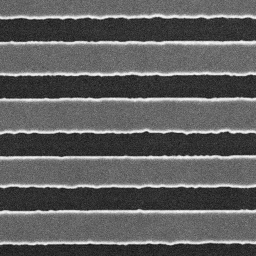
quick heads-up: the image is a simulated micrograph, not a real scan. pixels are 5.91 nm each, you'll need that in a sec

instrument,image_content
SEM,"lines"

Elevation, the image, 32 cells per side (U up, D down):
UUUUUUUUUUUUUUUUUUUUUUUUUUUUUUUU
UUUUUUUUUUUUUUUUUUUUUUUUUUUUUUUU
DDDDDDDDDDDDDDDDDDDDDDDDDDDDDDDD
DDDDDDDDDDDDDDDDDDDDDDDDDDDDDDDD
DDDDDDDDDDDDDDDDDDDDDDDDDDDDDDDD
UUUUUUUUUUUUUUUUUUUUUUUUUUUUUUUU
UUUUUUUUUUUUUUUUUUUUUUUUUUUUUUUU
UUUUUUUUUUUUUUUUUUUUUUUUUUUUUUUU
UUUUUUUUUUUUUUUUUUUUUUUUUUUUUUUU
DDDDDDDDDDDDDDDDDDDDDDDDDDDDDDDD
DDDDDDDDDDDDDDDDDDDDDDDDDDDDDDDD
DDDDDDDDDDDDDDDDDDDDDDDDDDDDDDDD
UUUUUUUUUUUUUUUUUUUUUUUUUUUUUUUU
UUUUUUUUUUUUUUUUUUUUUUUUUUUUUUUU
UUUUUUUUUUUUUUUUUUUUUUUUUUUUUUUU
UUUUUUUUUUUUUUUUUUUUUUUUUUUUUUUU
UUUUUUUUUUUUUUUUUUDUUUUUUUUUDUUU
DDDDDDDDDDDDDDDDDDDDDDDDDDDDDDDD
DDDDDDDDDDDDDDDDDDDDDDDDDDDDDDDD
DDDDDDDDDDDDDDDDDDUDUDUUDUUUUUUU
UUUUUUUUUUUUUUUUUUUUUUUUUUUUUUUU
UUUUUUUUUUUUUUUUUUUUUUUUUUUUUUUU
UUUUUUUUUUUUUUUUUUUUUUUUUUUUUUUU
DDDDDDDDDDDDDDDDDDDDDDDDDDDDDDDD
DDDDDDDDDDDDDDDDDDDDDDDDDDDDDDDD
DDDDDDDDDDDDDDDDDDDDDDDDDDDDDDDD
UUUUUUUUUUUUUUUUUUUUUUUUUUUUUUUU
UUUUUUUUUUUUUUUUUUUUUUUUUUUUUUUU
UUUUUUUUUUUUUUUUUUUUUUUUUUUUUUUU
UUUUUUUUUUUUUUUUUUUUUUUUUUUUUUUU
UUUUUUDDDDDDDDUUDDDDDUDDDDDDDDDD
DDDDDDDDDDDDDDDDDDDDDDDDDDDDDDDD